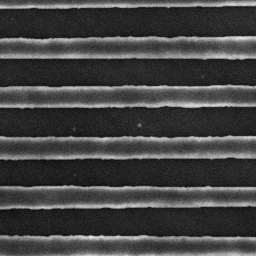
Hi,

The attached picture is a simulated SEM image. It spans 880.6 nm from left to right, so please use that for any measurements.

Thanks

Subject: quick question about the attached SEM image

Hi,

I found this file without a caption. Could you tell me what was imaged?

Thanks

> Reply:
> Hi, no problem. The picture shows lines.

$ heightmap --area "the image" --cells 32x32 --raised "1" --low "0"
11111111111111111111111111111111
00000000000000000000000000000000
00000000000000000000000000000000
00000000000000000000000000000000
00000000000000000000000000000000
11111111111111111111111111111111
11111111111111111111111111111111
00000000000000000000000000000000
00000000000000000000000000000000
00000000000000000000000000000000
00000000000000000000000000000000
11111111111111111111111111111111
11111111111111111111111111111111
00000000000000000000000000000000
00000000000000000000000000000000
00000000000000000000000000000000
00000000000000000000000000000000
11111111111111111111111111111111
11111111111111111111111111111111
11111111111111111111111111111111
00000000000000000000000000000000
00000000000000000000000000000000
00000000000000000000000000000000
11111111111111111111110111111111
11111111111111111111111111111111
11111111111111111111111111111111
00000000000000000000000000000000
00000000000000000000000000000000
00000000000000000000000000000000
10000011010000000010000000000000
11111111111111111111111111111111
11111111111111111111111111111111